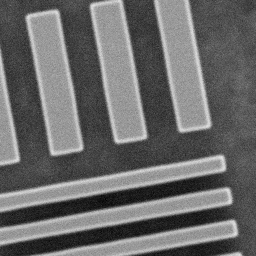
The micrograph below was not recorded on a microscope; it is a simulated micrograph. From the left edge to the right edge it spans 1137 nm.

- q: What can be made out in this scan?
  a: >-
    groups of lines, slits or small figures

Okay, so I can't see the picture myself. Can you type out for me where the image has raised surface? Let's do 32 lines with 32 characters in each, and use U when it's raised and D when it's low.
DDDDDDDDDDDDUUUDDDDUUUUDDDDDDDDD
DDDDDUUDDDDUUUUDDDDDUUUUDDDDDDDD
DDDUUUUDDDDDUUUUDDDDUUUUDDDDDDDD
DDDDUUUUDDDDUUUUDDDDUUUUDDDDDDDD
DDDDUUUUDDDDUUUUDDDDUUUUDDDDDDDD
DDDDUUUUDDDDUUUUDDDDUUUUDDDDDDDD
DDDDUUUUDDDDUUUUDDDDDUUUUDDDDDDD
DDDDUUUUDDDDDUUUUDDDDUUUUDDDDDDD
DDDDDUUUUDDDDUUUUDDDDUUUUDDDDDDD
UDDDDUUUUDDDDUUUUDDDDUUUUDDDDDDD
UDDDDUUUUDDDDUUUUDDDDUUUUDDDDDDD
UDDDDUUUUDDDDUUUUDDDDDUUUUDDDDDD
UDDDDUUUUDDDDUUUUUDDDDUUUUDDDDDD
UDDDDUUUUDDDDDUUUUDDDDUUUUDDDDDD
UDDDDDUUUUDDDDUUUUDDDDUUUUDDDDDD
UUDDDDUUUUDDDDUUUUDDDDUUUUDDDDDD
UUDDDDUUUUDDDDUUUUDDDDDDDDDDDDDD
UUDDDDUUUUDDDDUUUDDDDDDDDDDDDDDD
UUDDDDUUUUDDDDDDDDDDDDDDDDDDDDDD
UUDDDDDDDDDDDDDDDDDDDDDDDDDDDDDD
UDDDDDDDDDDDDDDDDDDDDDUUUUUUDDDD
DDDDDDDDDDDDDDDDUUUUUUUUUUUDDDDD
DDDDDDDDDDDUUUUUUUUUUUDDDDDDDDDD
DDDDDUUUUUUUUUUUDDDDDDDDDDDDDDDD
UUUUUUUUUUUDDDDDDDDDDDDUUUUUUDDD
UUUUUDDDDDDDDDDDDUUUUUUUUUUUDDDD
DDDDDDDDDDDUUUUUUUUUUUUDDDDDDDDD
DDDDDDUUUUUUUUUUUDDDDDDDDDDDDDDD
DUUUUUUUUUUUDDDDDDDDDDDDUUUUUUDD
UUUUUUDDDDDDDDDDDDUUUUUUUUUUUDDD
DDDDDDDDDDDDDUUUUUUUUUUUDDDDDDDD
DDDDDDDDUUUUUUUUUUDDDDDDDDDDDDDD